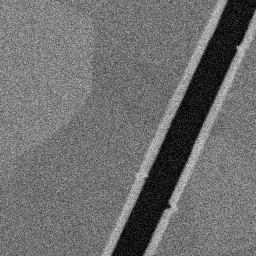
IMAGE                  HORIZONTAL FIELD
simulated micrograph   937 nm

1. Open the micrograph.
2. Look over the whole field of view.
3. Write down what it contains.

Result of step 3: one or a few lines or trenches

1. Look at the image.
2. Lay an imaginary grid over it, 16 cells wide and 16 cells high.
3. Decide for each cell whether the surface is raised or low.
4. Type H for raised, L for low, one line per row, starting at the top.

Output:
HHHHHHHHHHHHHHLL
HHHHHHHHHHHHHLLL
HHHHHHHHHHHHHLLH
HHHHHHHHHHHHLLLH
HHHHHHHHHHHHLLLH
HHHHHHHHHHHLLLHH
HHHHHHHHHHHLLLHH
HHHHHHHHHHLLLHHH
HHHHHHHHHHLLLHHH
HHHHHHHHHHLLHHHH
HHHHHHHHHLLLHHHH
HHHHHHHHHLLHHHHH
HHHHHHHHLLLHHHHH
HHHHHHHHLLHHHHHH
HHHHHHHLLLHHHHHH
HHHHHHHLLHHHHHHH